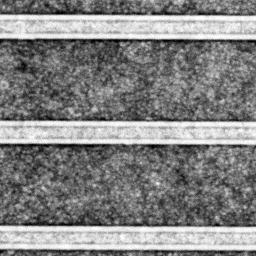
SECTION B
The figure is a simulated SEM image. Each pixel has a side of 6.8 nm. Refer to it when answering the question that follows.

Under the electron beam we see one or a few lines or trenches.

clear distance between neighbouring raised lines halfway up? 591 nanometres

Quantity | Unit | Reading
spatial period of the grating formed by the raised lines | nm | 718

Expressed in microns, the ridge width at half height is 0.13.